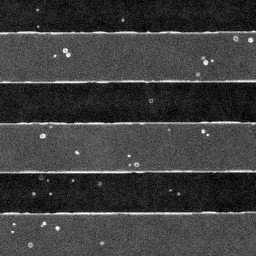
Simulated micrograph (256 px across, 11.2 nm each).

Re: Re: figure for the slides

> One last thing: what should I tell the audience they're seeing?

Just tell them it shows lines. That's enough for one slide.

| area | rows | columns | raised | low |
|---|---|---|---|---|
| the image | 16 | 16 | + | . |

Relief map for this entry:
................
................
++++++++++++++++
++++++++++++++++
++++++++++++++++
................
................
................
++++++++++++++++
++++++++++++++++
++++++++++++++++
................
................
++++++++++++++++
++++++++++++++++
++++++++++++++++